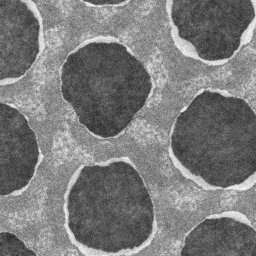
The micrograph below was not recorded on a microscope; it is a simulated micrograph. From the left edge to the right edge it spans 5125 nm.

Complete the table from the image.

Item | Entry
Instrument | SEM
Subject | holes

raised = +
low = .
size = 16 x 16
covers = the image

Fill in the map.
..+++++++++.....
..+++++++++.....
..+++++++++....+
..++....++++..++
..++.....+++++++
++++.....+++++++
++++.....+++...+
..+++...+++.....
..++++.++++.....
..+++++++++.....
..+++...+++.....
..++.....++++..+
++++.....+++++++
++++......++++++
++++......++....
..+++....++.....